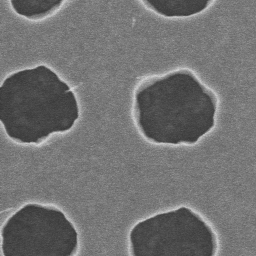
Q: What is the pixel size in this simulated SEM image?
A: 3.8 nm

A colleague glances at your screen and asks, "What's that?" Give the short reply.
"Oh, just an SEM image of holes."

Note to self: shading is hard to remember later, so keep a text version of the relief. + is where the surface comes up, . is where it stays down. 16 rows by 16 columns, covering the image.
+..+++++++...+++
++++++++++++++++
++++++++++++++++
++++++++++++++++
+..++++++++.++++
....+++++....+++
.....++++....+++
.....++++....+++
+..++++++....+++
++++++++++++++++
++++++++++++++++
++++++++++++++++
++++++++++++++++
+...++++++..++++
.....+++.....+++
.....+++.....+++